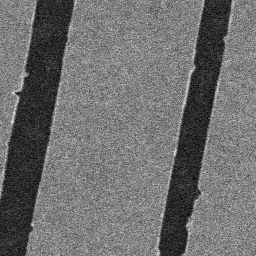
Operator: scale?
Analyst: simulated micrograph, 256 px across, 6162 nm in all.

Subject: one or a few lines or trenches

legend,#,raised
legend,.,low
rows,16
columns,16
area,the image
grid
##...########..#
##..########..##
##..########..##
##..########..##
##..########..##
#...########..##
#...########.###
#..########..###
#..########..###
...########..###
...########..###
...########.####
..########..####
..########..####
..########..####
..########..####